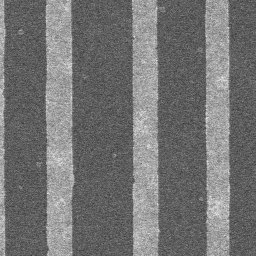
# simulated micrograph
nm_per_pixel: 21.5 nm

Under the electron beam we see one or a few lines or trenches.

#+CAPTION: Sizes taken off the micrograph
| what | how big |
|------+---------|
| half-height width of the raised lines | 508 nanometers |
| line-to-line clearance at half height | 1060 nanometres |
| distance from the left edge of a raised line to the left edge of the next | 1.7 microns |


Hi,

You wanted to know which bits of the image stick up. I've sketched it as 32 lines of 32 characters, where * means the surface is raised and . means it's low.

......***........***......**....
......***........***......**....
......***........***......**....
*.....***........***......**....
*.....***........***......***...
......***........***......**....
......***........***......***...
......***........***......**....
......***........***......**....
......***........***......**....
......***........***......***...
......***........***......***...
......***........***......***...
......***........***......***...
......***........***......***...
......***........***......***...
......***........***......***...
......***........***......***...
......***........***......***...
......***........***......***...
......***........***......***...
......***........***......***...
......***........***......***...
......***........***......***...
......***........***......***...
......***........***......***...
......***........***......***...
......***........***......**....
......***........***......***...
......***........***......***...
*.....***........***......***...
*.....***........***......***...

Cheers